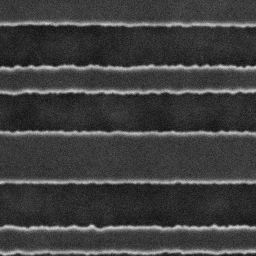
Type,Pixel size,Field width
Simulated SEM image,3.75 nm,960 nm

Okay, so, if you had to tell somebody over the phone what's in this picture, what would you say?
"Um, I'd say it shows lines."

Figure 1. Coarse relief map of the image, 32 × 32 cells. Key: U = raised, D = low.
UUUUUUUUUUUUUUUUUUUUUUUUUUUUUUUU
UUUUUUUUUUUUUUUUUUUUUUUUUUUUUUUU
UUUUUUUUUUUUUUUUUUUUUUUUUUUUUUUU
DDDDDDDDDDDDDDDDDDDDDDDDDDDDDDDD
DDDDDDDDDDDDDDDDDDDDDDDDDDDDDDDD
DDDDDDDDDDDDDDDDDDDDDDDDDDDDDDDD
DDDDDDDDDDDDDDDDDDDDDDDDDDDDDDDD
DDDDDDDDDDDDDDDDDDDDDDDDDDDDDDDD
UUUUUUUUUUUUUUUUUUUUUUUUUUUUUUUU
UUUUUUUUUUUUUUUUUUUUUUUUUUUUUUUU
UUUUUUUUUUUUUUUUUUUUUUUUUUUUUUUU
UUUUUUUUUUUUUUUUUUUUUUUUUUUUUUUU
DDDDDDDDDDDDDDDDDDDDDDDDDDDDDDDD
DDDDDDDDDDDDDDDDDDDDDDDDDDDDDDDD
DDDDDDDDDDDDDDDDDDDDDDDDDDDDDDDD
DDDDDDDDDDDDDDDDDDDDDDDDDDDDDDDD
UDUUUUUUDUUUUDUDDDDDDUDDUUDUDUDD
UUUUUUUUUUUUUUUUUUUUUUUUUUUUUUUU
UUUUUUUUUUUUUUUUUUUUUUUUUUUUUUUU
UUUUUUUUUUUUUUUUUUUUUUUUUUUUUUUU
UUUUUUUUUUUUUUUUUUUUUUUUUUUUUUUU
UUUUUUUUUUUUUUUUUUUUUUUUUUUUUUUU
UUUUUUUUUUUUUUUUUUUUUUUUUUUUUUUU
DDDDDDDDDDDDDDDDDDDDDDDDDDDDDDDD
DDDDDDDDDDDDDDDDDDDDDDDDDDDDDDDD
DDDDDDDDDDDDDDDDDDDDDDDDDDDDDDDD
DDDDDDDDDDDDDDDDDDDDDDDDDDDDDDDD
DDDDDDDDDDDDDDDDDDDDDDDDDDDDDDDD
UUUUUUUUUUUUDUUUUUUUUUUUUUUUUUUU
UUUUUUUUUUUUUUUUUUUUUUUUUUUUUUUU
UUUUUUUUUUUUUUUUUUUUUUUUUUUUUUUU
UUUUUUUUUUUUUUUUUUUUUUUUUUUUUUUU